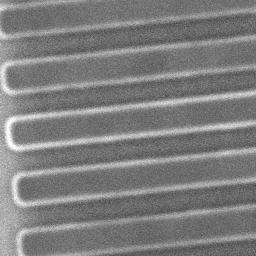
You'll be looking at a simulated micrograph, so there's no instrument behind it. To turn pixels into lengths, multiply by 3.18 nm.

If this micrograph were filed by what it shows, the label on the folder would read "parallel lines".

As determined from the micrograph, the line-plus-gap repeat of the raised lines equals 178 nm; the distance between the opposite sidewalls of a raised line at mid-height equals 97.5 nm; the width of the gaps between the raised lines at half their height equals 0.079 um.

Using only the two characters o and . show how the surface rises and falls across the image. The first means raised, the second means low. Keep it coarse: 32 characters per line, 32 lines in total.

...ooooooooooooooooooooooooooooo
ooooooooooooooooooooooooooooooo.
oooooooooooooooooooooo..........
oooooooooooo....................
ooo.............................
.......................ooooooooo
.............ooooooooooooooooooo
....oooooooooooooooooooooooooooo
oooooooooooooooooooooooooooooooo
ooooooooooooooooooooo...........
ooooooooooooo...................
.ooo............................
........................oooooooo
..............oooooooooooooooooo
.....ooooooooooooooooooooooooooo
.oooooooooooooooooooooooooooooo.
.ooooooooooooooooooooo..........
.oooooooooooo...................
..o.............................
........................oooooooo
...............ooooooooooooooooo
.....ooooooooooooooooooooooooooo
..oooooooooooooooooooooooooooooo
..ooooooooooooooooooooo.........
..ooooooooooo...................
...o............................
.........................ooooooo
................oooooooooooooooo
......oooooooooooooooooooooooooo
..oooooooooooooooooooooooooooooo
..ooooooooooooooooooooo.........
..oooooooooooo..................